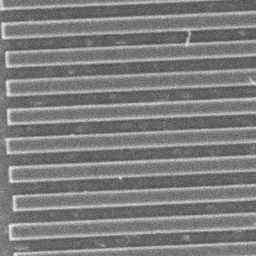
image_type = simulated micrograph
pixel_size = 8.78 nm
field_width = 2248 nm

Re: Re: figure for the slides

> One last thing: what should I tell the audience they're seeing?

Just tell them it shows parallel lines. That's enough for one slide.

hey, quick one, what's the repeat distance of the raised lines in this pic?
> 0.253 micrometres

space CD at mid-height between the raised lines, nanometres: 116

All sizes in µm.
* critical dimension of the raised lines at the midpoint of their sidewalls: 0.133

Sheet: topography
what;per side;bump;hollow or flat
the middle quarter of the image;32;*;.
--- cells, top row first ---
................................
................................
........................********
...*****************************
********************************
********************************
***************.................
................................
................................
.............................***
....**.*************************
********************************
********************************
*********************...........
................................
................................
................................
...........*********************
********************************
********************************
***********************.........
*...............................
................................
................................
.................***************
********************************
********************************
*****************************...
********........................
................................
................................
...................*************